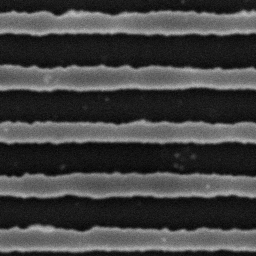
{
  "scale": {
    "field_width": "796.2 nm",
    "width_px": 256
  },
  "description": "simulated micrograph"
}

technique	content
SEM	lines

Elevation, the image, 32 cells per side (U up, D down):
DDDDDDDDDDDDDDDDDDDDDDDDDDDDDDDD
DUDDDUDDDDDDDDDDDDDUUUUUDDDDDDDD
UUUUUUUUUUUUUUUUUUUUUUUUUUUUUUUU
UUUUUUUUUUUUUUUUUUUUUUUUUUUUUUUU
DDDDDDDDDDDDDDDDDDDDDDDDDDDDDDDD
DDDDDDDDDDDDDDDDDDDDDDDDDDDDDDDD
DDDDDDDDDDDDDDDDDDDDDDDDDDDDDDDD
DDDDDDDDDDDDDDDDDDDDDDDDDDDDDDDD
UUUDUDDUUUUUUUDUDDUUUUDDDDDDDDDD
UUUUUUUUUUUUUUUUUUUUUUUUUUUUUUUU
UUUUUUUUUUUUUUUUUUUUUUUUUUUUUUUU
DDDDDDDDDDDDDDDDDDDDDDDDDDDDDDDD
DDDDDDDDDDDDDDDDDDDDDDDDDDDDDDDD
DDDDDDDDDDDDDDDDDDDDDDDDDDDDDDDD
DDDDDDDDDDDDDDDDDDDDDDDDDDDDDDDD
UUUUUUUUUUUUUUDUUUUUUUUUUUDUDUUU
UUUUUUUUUUUUUUUUUUUUUUUUUUUUUUUU
UUUUUUUUUUUUUUUUUUUUUUUUUUUUUUUU
DDDDDDDDDDDDDDDDDDDDDDDDDDDDDDDD
DDDDDDDDDDDDDDDDDDDDDDDDDDDDDDDD
DDDDDDDDDDDDDDDDDDDDDDDDDDDDDDDD
DDDDDDDDDDDDDDDDDDDDDDDDDDDDDDDD
UUUUUUUUUUUUUUUUUUUUUUUUUUUUUUUU
UUUUUUUUUUUUUUUUUUUUUUUUUUUUUUUU
DDUUUUUDDDDUUUUUUDDUUUUUUUUDDDUU
DDDDDDDDDDDDDDDDDDDDDDDDDDDDDDDD
DDDDDDDDDDDDDDDDDDDDDDDDDDDDDDDD
DDDDDDDDDDDDDDDDDDDDDDDDDDDDDDDD
DDDDUDDDDDDDUUUDDDDDDDDDDUDDDDDD
UUUUUUUUUUUUUUUUUUUUUUUUUUUUUUUU
UUUUUUUUUUUUUUUUUUUUUUUUUUUUUUUU
DDDDDDDDDDDDDDDDDDDDDDDDDDDDDDDD